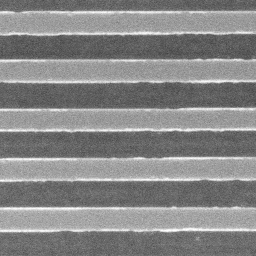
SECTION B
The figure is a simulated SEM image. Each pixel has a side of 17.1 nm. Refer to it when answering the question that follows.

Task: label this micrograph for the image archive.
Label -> lines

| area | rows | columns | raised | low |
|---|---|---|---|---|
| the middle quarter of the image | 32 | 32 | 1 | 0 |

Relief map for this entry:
11111111111111111111111111111111
11111111111111111111111111111111
11111111111111111111111111111111
11111111111111111111111111111111
11111111101011000000000110000000
00000000000000000000000000000000
00000000000000000000000000000000
00000000000000000000000000000000
00000000000000000000000000000000
00000000000000000000000000000000
00000000000000000000000000000000
11111111111111111111111111111111
11111111111111111111111111111111
11111111111111111111111111111111
11111111111111111111111111111111
11111111111111111111111111111111
11111111111111100000000100000110
00000000000000000000000000000000
00000000000000000000000000000000
00000000000000000000000000000000
00000000000000000000000000000000
00000000000000000000000000000000
00000000000000000000000000000000
00000000000000000000000000000000
11111111111111111111111111111111
11111111111111111111111111111111
11111111111111111111111111111111
11111111111111111111111111111111
11111111111111111111111111111111
00000000000000000000000000000000
00000000000000000000000000000000
00000000000000000000000000000000